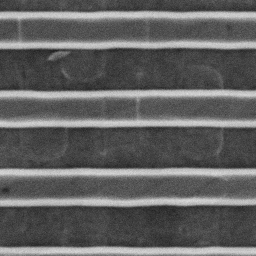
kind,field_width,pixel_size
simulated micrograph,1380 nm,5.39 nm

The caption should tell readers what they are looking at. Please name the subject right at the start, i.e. wiring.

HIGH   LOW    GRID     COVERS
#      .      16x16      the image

................
################
################
................
................
................
################
################
................
................
................
################
################
................
................
................